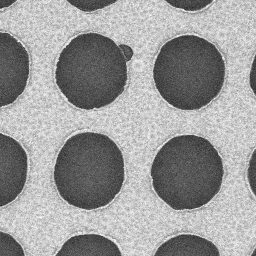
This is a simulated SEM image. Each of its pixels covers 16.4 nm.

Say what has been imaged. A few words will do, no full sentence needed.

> holes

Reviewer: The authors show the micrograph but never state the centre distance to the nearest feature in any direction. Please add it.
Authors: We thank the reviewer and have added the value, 1590 nanometers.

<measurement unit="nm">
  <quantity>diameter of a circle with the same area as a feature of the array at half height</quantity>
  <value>1220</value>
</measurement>